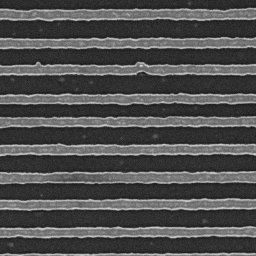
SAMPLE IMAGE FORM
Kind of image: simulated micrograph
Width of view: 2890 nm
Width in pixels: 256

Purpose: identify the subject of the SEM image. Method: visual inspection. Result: parallel lines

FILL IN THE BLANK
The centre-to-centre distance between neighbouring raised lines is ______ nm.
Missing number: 307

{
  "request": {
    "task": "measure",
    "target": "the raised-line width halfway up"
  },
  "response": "100 nm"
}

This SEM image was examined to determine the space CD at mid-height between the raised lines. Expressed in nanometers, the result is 210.